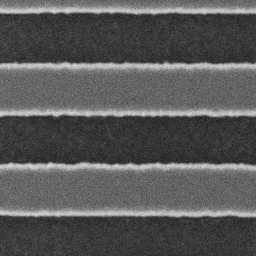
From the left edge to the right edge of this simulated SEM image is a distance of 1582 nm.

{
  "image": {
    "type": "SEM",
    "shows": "lines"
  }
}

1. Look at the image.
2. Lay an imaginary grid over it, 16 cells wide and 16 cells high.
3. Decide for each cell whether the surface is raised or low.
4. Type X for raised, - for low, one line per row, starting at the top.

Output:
XXXXXXXXXXXXXXXX
----------------
----------------
----------------
XXXXXXXXXXXXXXXX
XXXXXXXXXXXXXXXX
XXXXXXXXXXXXXXXX
----------------
----------------
----------------
XXXXXXXXXXXXXXXX
XXXXXXXXXXXXXXXX
XXXXXXXXXXXXXXXX
-----------XXX-X
----------------
----------------